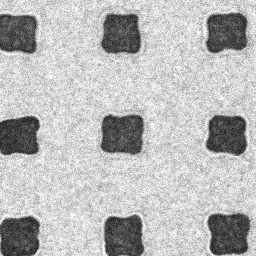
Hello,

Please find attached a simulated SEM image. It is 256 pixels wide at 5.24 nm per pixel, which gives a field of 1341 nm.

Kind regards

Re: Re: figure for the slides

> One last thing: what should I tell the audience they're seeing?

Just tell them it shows holes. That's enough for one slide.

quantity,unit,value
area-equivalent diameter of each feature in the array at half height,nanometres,232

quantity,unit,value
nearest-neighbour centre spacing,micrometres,0.532